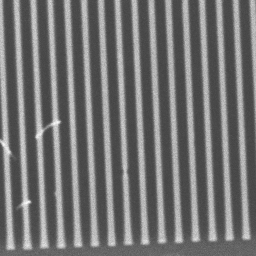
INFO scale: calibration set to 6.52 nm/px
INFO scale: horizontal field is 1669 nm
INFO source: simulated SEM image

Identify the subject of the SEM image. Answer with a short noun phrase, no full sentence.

parallel lines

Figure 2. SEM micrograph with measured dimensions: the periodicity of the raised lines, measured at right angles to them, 110 nm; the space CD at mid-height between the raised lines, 0.0643 µm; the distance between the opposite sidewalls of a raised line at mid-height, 45.6 nanometers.